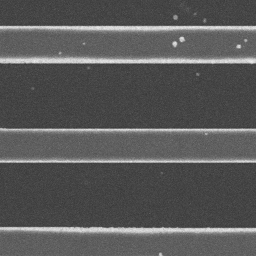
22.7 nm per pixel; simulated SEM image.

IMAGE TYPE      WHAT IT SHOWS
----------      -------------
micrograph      lines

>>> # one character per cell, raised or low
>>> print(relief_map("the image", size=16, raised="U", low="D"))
DDDDDDDDDDDDDDDD
DDDDDDDDDDDDDDDD
UUUUUUUUUUUUUUUU
UUUUUUUUUUUUUUUU
DDDDDDDDDDDDDDDD
DDDDDDDDDDDDDDDD
DDDDDDDDDDDDDDDD
DDDDDDDDDDDDDDDD
UUUUUUUUUUUUUUUU
UUUUUUUUUUUUUUUU
DDDDDDDDDDDDDDDD
DDDDDDDDDDDDDDDD
DDDDDDDDDDDDDDDD
DDDDDDDDDDDDDDDD
UUUUUUUUUUUUUUUU
UUUUUUUUUUUUUUUU